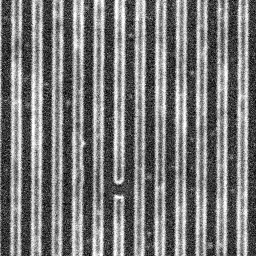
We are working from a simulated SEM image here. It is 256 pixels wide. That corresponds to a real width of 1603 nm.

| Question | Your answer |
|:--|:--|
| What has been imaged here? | parallel lines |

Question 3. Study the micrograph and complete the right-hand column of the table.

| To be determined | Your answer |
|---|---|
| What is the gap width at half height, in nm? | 77.5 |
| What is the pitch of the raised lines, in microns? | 0.129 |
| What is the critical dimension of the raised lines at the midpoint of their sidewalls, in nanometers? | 50.1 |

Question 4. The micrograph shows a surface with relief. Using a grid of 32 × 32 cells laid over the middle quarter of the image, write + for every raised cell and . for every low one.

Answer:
...++...++...++...++...++...++..
...++...++...++...++...++...++..
...++...++...++...++...++...++..
...++...++...++...++...++...++..
...++...++...++...++...++...++..
...++...++...++...++...++...++..
...+....++...++...++...++...++..
...+....++...++...++...++...++..
...+....++...++...++...++...++..
...+....++...++...++...++...++..
...+....++...++...++...++...++..
..++....++...++...++...++...++..
..++....++...++...++...++...++..
..++....++...++...++...++...++..
..++....++...++...++...++...++..
..++....++...++...++...++...++..
..++....++...++...++...++...++..
..++....++...++...++...++...++..
..++....++...++...++...++...++..
..+++...++...++...++...++...++..
..+++...++...++...++...++...++..
..++....++...++...++...++...++..
..++....++...++...++...++...++..
..++....++...++...++...++...++..
..++....++...++...++...++...++..
..+++...++...++...++...++...++..
..+++...++...++...++...++...++..
..+++...++...++...++...++...++..
..+++...+....++...++...++...++..
..+++...+....+....++...++...++..
..++....+.........++...++...++..
..++....+.........++...++...++..